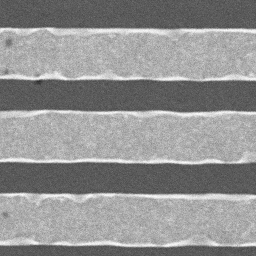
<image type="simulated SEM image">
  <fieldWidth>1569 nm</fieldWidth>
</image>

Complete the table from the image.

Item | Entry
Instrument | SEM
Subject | wiring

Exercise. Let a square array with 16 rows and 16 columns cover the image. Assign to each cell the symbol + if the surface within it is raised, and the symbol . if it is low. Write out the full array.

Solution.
................
................
++++++++++++++++
++++++++++++++++
++++++++++++++++
................
................
++++++++++++++++
++++++++++++++++
++++++++++++++++
................
................
++++++++++++++++
++++++++++++++++
++++++++++++++++
................